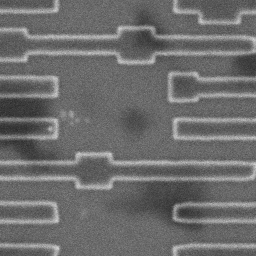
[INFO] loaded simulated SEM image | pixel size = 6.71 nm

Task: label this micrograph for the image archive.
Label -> wiring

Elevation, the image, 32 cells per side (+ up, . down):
+++++++...............++++++++++
+++++.................++++++++++
.........................+++++..
...............++++.............
++++.++++....+++++++............
++++++++++++++++++++++++++++++++
++++++++++++++++++++++++++++++++
+++............++++.............
................................
.....................++++.......
+++++++..............+++++++++++
+++++++..............+++++++++++
.....................+++........
................................
................................
+++++++...............++++++++++
+++++++...............++++++++++
................................
................................
..........++++..................
++++++++++++++++++++++++++++++++
++++++++++++++++++++++++++++++++
.........++++++.................
................................
................................
+++++++................+++++++++
+++++++...............++++++++++
+++++++...............++++++++++
................................
................................
................................
+++++++...............++++++++++